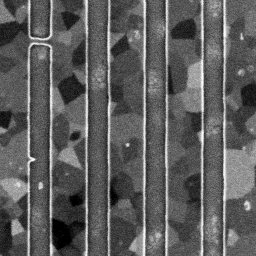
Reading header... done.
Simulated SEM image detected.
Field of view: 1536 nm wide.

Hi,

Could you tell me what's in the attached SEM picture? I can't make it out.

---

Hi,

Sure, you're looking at parallel lines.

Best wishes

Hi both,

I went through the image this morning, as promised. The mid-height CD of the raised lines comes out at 220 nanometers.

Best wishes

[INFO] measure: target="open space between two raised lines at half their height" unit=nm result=127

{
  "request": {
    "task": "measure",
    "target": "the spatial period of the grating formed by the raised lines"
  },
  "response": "57.8 px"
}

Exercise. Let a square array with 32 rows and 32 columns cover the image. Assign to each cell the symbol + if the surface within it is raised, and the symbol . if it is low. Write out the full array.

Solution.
++++..+++++...++++...++++...++++
++++..+++++...++++...++++...++++
++++..+++++...++++...++++...++++
++++..+++++...++++...++++...++++
++++..+++++...++++...++++...++++
++++.++++++...++++...++++...++++
++++..+++++...++++...++++...++++
++++..+++++...++++...++++...++++
++++..+++++...++++...++++...++++
++++..+++++...++++...++++...++++
++++..+++++...++++...++++...++++
++++..+++++...++++...++++...++++
++++..+++++...++++...++++...++++
++++..+++++...++++...++++...++++
++++..+++++...++++...++++...++++
++++..+++++...++++...++++...++++
++++..+++++...++++...++++...++++
++++..+++++...++++...++++...++++
++++..+++++...++++...++++...++++
++++..+++++...++++...++++...++++
++++..+++++...++++...++++...++++
++++..+++++...++++...++++...++++
++++..+++++...++++...++++...++++
++++..+++++...++++...++++...++++
++++..+++++...++++...++++...++++
++++..+++++...++++...++++...++++
++++..+++++...++++...++++...++++
++++..+++++...++++...++++...++++
++++..+++++...++++...++++...++++
++++..+++++...++++...++++...++++
++++..+++++...++++...++++...++++
++++..+++++...++++...++++...++++